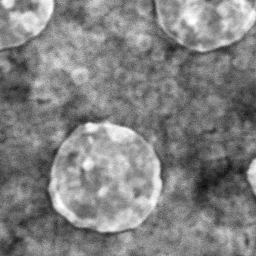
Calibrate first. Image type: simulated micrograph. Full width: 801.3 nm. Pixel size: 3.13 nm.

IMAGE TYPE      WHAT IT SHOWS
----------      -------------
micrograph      raised bodies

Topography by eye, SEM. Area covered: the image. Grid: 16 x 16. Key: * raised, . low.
***.......******
***.......******
**.........****.
................
................
................
................
................
....*****.......
....******......
...*******......
...*******......
...*******......
....*****.......
.......*........
................